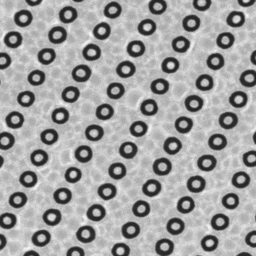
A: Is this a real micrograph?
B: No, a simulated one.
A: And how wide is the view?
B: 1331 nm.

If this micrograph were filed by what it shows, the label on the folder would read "a regular array of ring-shaped grooves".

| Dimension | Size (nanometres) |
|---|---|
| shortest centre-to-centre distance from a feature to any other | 122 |